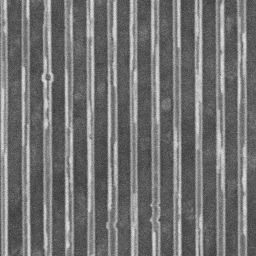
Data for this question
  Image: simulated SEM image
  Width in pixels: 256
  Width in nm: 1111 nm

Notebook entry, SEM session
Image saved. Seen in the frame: parallel lines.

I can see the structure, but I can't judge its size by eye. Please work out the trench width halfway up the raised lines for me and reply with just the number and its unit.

63.5 nanometres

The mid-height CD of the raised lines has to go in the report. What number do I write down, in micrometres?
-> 0.0315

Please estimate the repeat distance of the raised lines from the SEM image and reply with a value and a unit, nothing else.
21.7 pixels